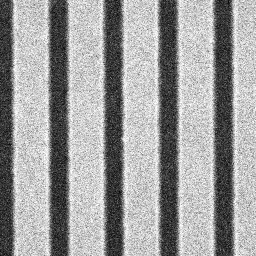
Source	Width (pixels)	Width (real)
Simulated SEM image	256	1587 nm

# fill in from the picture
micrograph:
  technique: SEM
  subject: parallel lines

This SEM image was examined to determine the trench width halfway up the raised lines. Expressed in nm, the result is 105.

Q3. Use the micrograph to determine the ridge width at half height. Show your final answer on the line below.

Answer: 0.233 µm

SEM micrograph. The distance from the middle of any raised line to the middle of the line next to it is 54.9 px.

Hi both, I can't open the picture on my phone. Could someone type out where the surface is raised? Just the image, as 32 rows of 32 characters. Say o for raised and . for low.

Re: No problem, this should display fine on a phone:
.ooooo..ooooo..ooooo..ooooo..ooo
..oooo..ooooo..ooooo..ooooo..ooo
.ooooo..ooooo..ooooo..ooooo..ooo
..oooo..ooooo..ooooo..ooooo..ooo
..oooo..ooooo..ooooo..ooooo..ooo
..oooo..ooooo..ooooo..ooooo..ooo
..oooo..ooooo..ooooo..ooooo..ooo
..oooo..ooooo..ooooo..ooooo..ooo
..oooo..ooooo..ooooo..ooooo..ooo
..oooo..ooooo..ooooo..ooooo..ooo
..oooo...oooo..ooooo..ooooo..ooo
..oooo..ooooo..ooooo..ooooo..ooo
..oooo..ooooo..ooooo..ooooo..ooo
..oooo..ooooo..ooooo..ooooo..ooo
..oooo..ooooo..ooooo..ooooo..ooo
..oooo..ooooo..ooooo..ooooo..ooo
..oooo..ooooo..ooooo..ooooo..ooo
..oooo..ooooo..ooooo..ooooo..ooo
..oooo..ooooo..ooooo..ooooo..ooo
..oooo..ooooo..ooooo..ooooo..ooo
..oooo...oooo..ooooo..ooooo..ooo
..oooo..ooooo..ooooo..ooooo..ooo
..oooo..ooooo..ooooo..ooooo..ooo
..oooo..ooooo..ooooo..ooooo..ooo
..oooo...oooo..ooooo..ooooo..ooo
..oooo...oooo..ooooo..ooooo..ooo
..oooo...oooo..ooooo..ooooo..ooo
..oooo...oooo..ooooo..ooooo..ooo
..oooo...oooo..ooooo..ooooo..ooo
..oooo...oooo..ooooo..ooooo..ooo
..oooo...oooo..ooooo..ooooo..ooo
..oooo...oooo..ooooo..ooooo..ooo